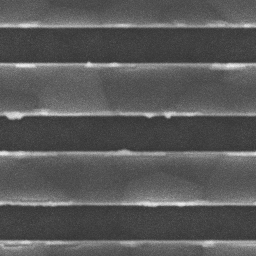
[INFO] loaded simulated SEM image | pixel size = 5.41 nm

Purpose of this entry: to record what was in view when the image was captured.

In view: one or a few lines or trenches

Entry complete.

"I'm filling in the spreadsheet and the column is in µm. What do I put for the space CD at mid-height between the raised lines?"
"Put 0.197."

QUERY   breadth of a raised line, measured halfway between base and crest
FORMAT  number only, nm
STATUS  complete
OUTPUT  282